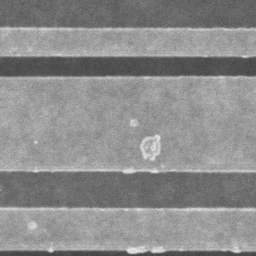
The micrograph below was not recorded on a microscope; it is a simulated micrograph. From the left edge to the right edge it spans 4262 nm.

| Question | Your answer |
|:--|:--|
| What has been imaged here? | lines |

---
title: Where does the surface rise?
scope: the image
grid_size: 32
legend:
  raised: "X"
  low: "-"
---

--------------------------------
--------------------------------
--------------------------------
--------------------------------
XXXXXXXXXXXXXXXXXXXXXXXXXXXXXXXX
XXXXXXXXXXXXXXXXXXXXXXXXXXXXXXXX
XXXXXXXXXXXXXXXXXXXXXXXXXXXXXXXX
--------------------------------
--------------------------------
--------------------------------
XXXXXXXXXXXXXXXXXXXXXXXXXXXXXXXX
XXXXXXXXXXXXXXXXXXXXXXXXXXXXXXXX
XXXXXXXXXXXXXXXXXXXXXXXXXXXXXXXX
XXXXXXXXXXXXXXXXXXXXXXXXXXXXXXXX
XXXXXXXXXXXXXXXXXXXXXXXXXXXXXXXX
XXXXXXXXXXXXXXXXXXXXXXXXXXXXXXXX
XXXXXXXXXXXXXXXXXXXXXXXXXXXXXXXX
XXXXXXXXXXXXXXXXXXXXXXXXXXXXXXXX
XXXXXXXXXXXXXXXXXXXXXXXXXXXXXXXX
XXXXXXXXXXXXXXXXXXXXXXXXXXXXXXXX
XXXXXXXXXXXXXXXXXXXXXXXXXXXXXXXX
---------------XX--X------------
--------------------------------
--------------------------------
--------------------------------
--------------------------------
XXXXXXXXXXXXXXXXXXXXXXXXXXXXXXXX
XXXXXXXXXXXXXXXXXXXXXXXXXXXXXXXX
XXXXXXXXXXXXXXXXXXXXXXXXXXXXXXXX
XXXXXXXXXXXXXXXXXXXXXXXXXXXXXXXX
XXXXXXXXXXXXXXXXXXXXXXXXXXXXXXXX
----------------XX-X---------X--